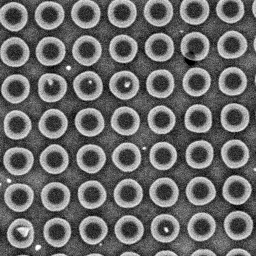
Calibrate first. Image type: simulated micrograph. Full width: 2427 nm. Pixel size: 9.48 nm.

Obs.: an array of small figures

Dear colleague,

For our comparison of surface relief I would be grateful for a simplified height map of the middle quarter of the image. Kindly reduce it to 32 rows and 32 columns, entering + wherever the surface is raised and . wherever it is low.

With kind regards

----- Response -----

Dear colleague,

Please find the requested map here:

................................
...............................+
....++++.....++++.....+++++...++
...++++++...++++++...++++++...++
..+++++++..++++++++..++++++...++
+.++++++++.++++++++..++++++...++
+..++++++...++++++...++++++...++
...++++++....+++++....++++.....+
....++++......+++...............
................................
................................
.....+++.....++++.....++++.....+
...++++++...++++++...++++++...++
...+++++++..+++++++..+++++++..++
+..+++++++..+++++++..+++++++..++
+..+++++++..+++++++..++++++...++
....+++++....+++++....+++++.....
.....+++......+++...............
................................
................................
.....+++......++++....+++++....+
....+++++....++++++...++++++...+
+..+++++++..+++++++...++++++...+
+..+++++++..+++++++...++++++...+
+..+++++++...++++++...++++++...+
+...++++++...++++++....++++.....
.....++++......++...............
................................
................................
......++......++++.....++++....+
....++++++...++++++...++++++...+
+...++++++...++++++...++++++...+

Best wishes